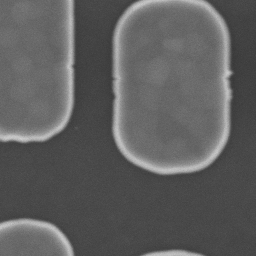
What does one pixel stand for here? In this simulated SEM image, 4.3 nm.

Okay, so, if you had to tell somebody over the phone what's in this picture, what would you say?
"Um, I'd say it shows one or a few lines or trenches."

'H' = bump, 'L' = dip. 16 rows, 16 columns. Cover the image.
HHHHHLLLHHHHHLLL
HHHHHLLHHHHHHHLL
HHHHHLLHHHHHHHLL
HHHHHLLHHHHHHHLL
HHHHHLLHHHHHHHLL
HHHHHLLHHHHHHHLL
HHHHHLLHHHHHHHLL
HHHHLLLHHHHHHHLL
HHHLLLLHHHHHHHLL
LLLLLLLLHHHHHHLL
LLLLLLLLLHHHLLLL
LLLLLLLLLLLLLLLL
LLLLLLLLLLLLLLLL
LLLLLLLLLLLLLLLL
HHHHLLLLLLLLLLLL
HHHHLLLLLLLLLLLL